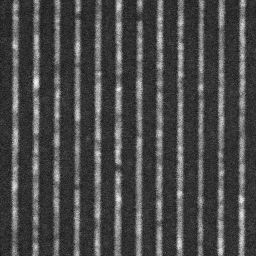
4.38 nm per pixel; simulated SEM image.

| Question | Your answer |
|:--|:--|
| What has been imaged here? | parallel lines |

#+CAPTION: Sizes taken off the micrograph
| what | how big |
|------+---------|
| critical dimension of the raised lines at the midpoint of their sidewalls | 19.7 nm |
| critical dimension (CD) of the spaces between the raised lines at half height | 71.7 nanometers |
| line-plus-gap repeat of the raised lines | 0.0902 micrometres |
